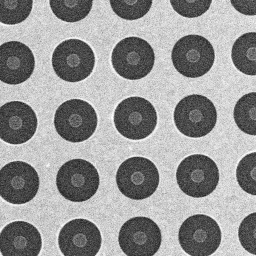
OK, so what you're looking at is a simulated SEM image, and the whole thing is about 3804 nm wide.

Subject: an array of small figures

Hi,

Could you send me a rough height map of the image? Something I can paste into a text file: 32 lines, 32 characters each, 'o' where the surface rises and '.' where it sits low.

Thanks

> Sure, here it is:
....oo......oo.....oo.....ooo...
....ooo....ooo.....ooo....oooo..
...ooooo..oooooo.ooooooooooooooo
oooooooooooooooooooooooooooooooo
oooooooooooooooo.oooooo..ooooo..
...oooo....ooo.....ooo....ooo...
....ooo.....oo.....oo......oo...
....oo......oo.....oo......oo...
....ooo.....oo.....ooo....ooo...
....ooo....oooo...ooooo..ooooooo
o.oooooooooooooooooooooooooooooo
oooooooooooooooooooooooooooooooo
oooooooo...oooo...ooooo...oooo..
....ooo.....oo.....ooo.....oo...
.....oo.....oo......oo.....oo...
.....oo.....oo......oo.....oo...
....ooo.....ooo....ooo....oooo..
....oooo...ooooo..oooooooooooooo
oooooooooooooooooooooooooooooooo
ooooooooooooooooooooooo...oooo..
o...oooo....ooo....ooo.....ooo..
.....oo.....ooo.....oo.....oo...
.....oo......o......oo.....ooo..
.....oo.....ooo.....oo.....ooo..
....oooo....oooo...ooooo..oooooo
o..ooooooooooooooooooooooooooooo
oooooooooooooooooooooooooooooooo
ooooooooo..ooooo...oooo....ooo..
.....ooo....ooo.....oo......oo..
.....oo......oo.....oo......oo..
.....oo......oo.....oo......oo..
.....ooo....ooo.....ooo....oooo.